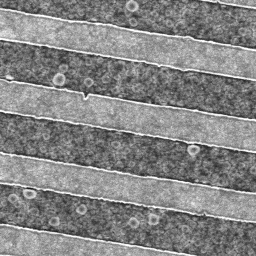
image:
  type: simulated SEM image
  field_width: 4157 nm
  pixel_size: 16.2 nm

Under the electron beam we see one or a few lines or trenches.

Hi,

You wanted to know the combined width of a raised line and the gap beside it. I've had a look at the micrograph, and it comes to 1150 nanometres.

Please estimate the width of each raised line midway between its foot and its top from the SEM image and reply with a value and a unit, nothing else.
483 nanometers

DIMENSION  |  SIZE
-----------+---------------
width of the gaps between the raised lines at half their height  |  655 nm